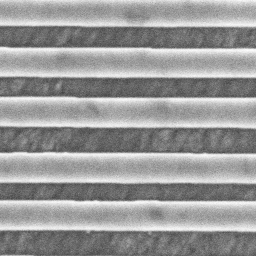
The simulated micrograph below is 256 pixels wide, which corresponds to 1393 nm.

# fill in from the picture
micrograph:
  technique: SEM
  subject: lines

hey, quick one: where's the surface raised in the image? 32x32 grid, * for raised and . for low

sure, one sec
********************************
********************************
********************************
................................
................................
................................
********************************
********************************
********************************
********************************
................................
................................
********************************
********************************
********************************
********************************
................................
................................
................................
********************************
********************************
********************************
********************************
................................
................................
********************************
********************************
********************************
********************************
................................
................................
................................